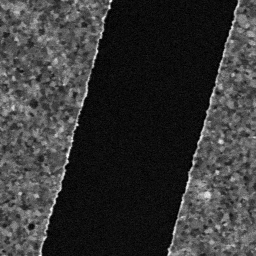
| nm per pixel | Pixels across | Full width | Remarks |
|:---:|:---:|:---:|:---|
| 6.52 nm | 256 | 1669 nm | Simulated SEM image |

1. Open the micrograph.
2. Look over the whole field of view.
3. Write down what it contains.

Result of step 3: one or a few lines or trenches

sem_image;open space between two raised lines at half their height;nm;802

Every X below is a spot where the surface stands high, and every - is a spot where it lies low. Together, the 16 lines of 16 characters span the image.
XXXXXXX--------X
XXXXXX---------X
XXXXXX--------XX
XXXXXX--------XX
XXXXXX--------XX
XXXXX--------XXX
XXXXX--------XXX
XXXXX--------XXX
XXXXX--------XXX
XXXX--------XXXX
XXXX--------XXXX
XXXX--------XXXX
XXX--------XXXXX
XXX--------XXXXX
XXX--------XXXXX
XXX--------XXXXX